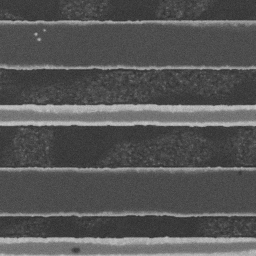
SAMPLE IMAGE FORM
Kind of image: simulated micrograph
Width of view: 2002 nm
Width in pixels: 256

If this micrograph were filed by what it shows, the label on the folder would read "lines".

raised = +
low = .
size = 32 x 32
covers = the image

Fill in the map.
................................
................................
................................
++++++++++++++++++++++++++++++++
++++++++++++++++++++++++++++++++
++++++++++++++++++++++++++++++++
++++++++++++++++++++++++++++++++
++++++++++++++++++++++++++++++++
++++++++++++++++++++++++++++++++
................................
................................
................................
................................
++++++++++++++++++++++++++++++++
++++++++++++++++++++++++++++++++
+++++++++++++++++.++++++++++++++
................................
................................
................................
................................
................................
++++++++++++++++++++++++++++++++
++++++++++++++++++++++++++++++++
++++++++++++++++++++++++++++++++
++++++++++++++++++++++++++++++++
++++++++++++++++++++++++++++++++
++++++++++++++++++++++++++++++++
................................
................................
................................
++++++++++++++++++++++++++++++++
++++++++++++++++++++++++++++++++